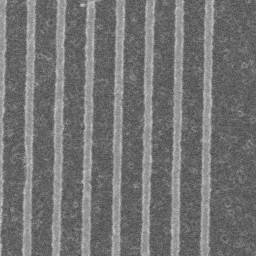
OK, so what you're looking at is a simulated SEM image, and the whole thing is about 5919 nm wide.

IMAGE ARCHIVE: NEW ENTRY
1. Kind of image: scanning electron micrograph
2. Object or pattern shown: parallel lines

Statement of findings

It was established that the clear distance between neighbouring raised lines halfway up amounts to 0.526 µm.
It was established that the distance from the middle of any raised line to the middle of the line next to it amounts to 684 nanometres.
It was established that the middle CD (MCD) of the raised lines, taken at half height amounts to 162 nm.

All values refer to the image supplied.